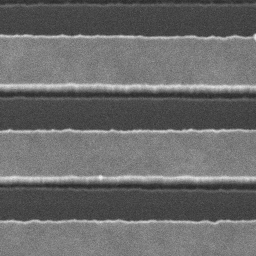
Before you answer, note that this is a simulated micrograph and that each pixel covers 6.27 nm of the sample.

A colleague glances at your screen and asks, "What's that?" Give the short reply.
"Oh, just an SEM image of lines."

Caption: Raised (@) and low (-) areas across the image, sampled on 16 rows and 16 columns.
----------------
----------------
@@@@@@@@@@@@@@@@
@@@@@@@@@@@@@@@@
@@@@@@@@@@@@@@@@
-------@@@@@@@@@
----------------
----------------
@@@@@@@@@@@@@@@@
@@@@@@@@@@@@@@@@
@@@@@@@@@@@@@@@@
----------------
----------------
----------------
@@@@@@@@@@@@@@@@
@@@@@@@@@@@@@@@@